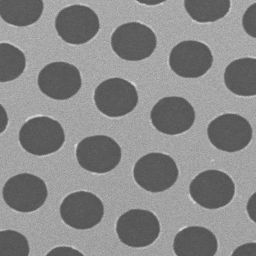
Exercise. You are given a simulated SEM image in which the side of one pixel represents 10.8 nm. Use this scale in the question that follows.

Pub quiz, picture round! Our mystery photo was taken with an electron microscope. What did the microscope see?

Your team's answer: a regular array of holes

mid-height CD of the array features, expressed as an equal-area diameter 449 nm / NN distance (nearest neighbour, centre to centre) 632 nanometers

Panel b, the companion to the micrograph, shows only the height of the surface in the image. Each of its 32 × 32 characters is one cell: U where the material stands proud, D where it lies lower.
DDDDDUUUUUUUUUUUUUDDUUUDDDDDDUUU
DDDDDUUUDDDDUUUUUUUUUUUDDDDDUUUD
DDDDDUUDDDDDUUUUUUUUUUUUDDDUUUDD
UUUUUUUDDDDDUUUDDDDUUUUUUUUUUUDD
UUUUUUUDDDDDUUDDDDDUUUUUUUUUUUUD
DUUUUUUUUDUUUUDDDDDDUUDDDDUUUUUU
DDDUUUUUUUUUUUDDDDDUUDDDDDUUUUUU
DDDUUUUUUUUUUUUUDDUUUDDDDDDUUDDD
DDDUUDDDDDUUUUUUUUUUUDDDDDUUDDDD
DDUUUDDDDDUUUUUUUUUUUUDDDUUUDDDD
UUUUUDDDDDUUDDDDUUUUUUUUUUUUDDDD
UUUUUDDDDDUUDDDDDUUUUUUUUUUUUDDD
UUUUUUUDUUUUDDDDDUUUDDDUUUUUUUUU
UUUUUUUUUUUUDDDDDUUDDDDDUUUUUUUU
DUUUUUUUUUUUUUDUUUUDDDDDUUUDDDUU
DUUDDDDUUUUUUUUUUUUDDDDDUUDDDDDU
UUDDDDDDUUUUUUUUUUUUDDDUUUDDDDDU
UUDDDDDDUUDDDDUUUUUUUUUUUUDDDDDU
UUUDDDDUUUDDDDDUUUUUUUUUUUUDDDUU
UUUUUUUUUUDDDDDUUUDDDUUUUUUUUUUU
UUUUUUUUUUDDDDDUUDDDDDUUUUUUUUUU
UUUUUUUUUUUUDUUUUDDDDDUUUDDDUUUU
UDDDDUUUUUUUUUUUUDDDDDUUDDDDDUUU
DDDDDDUUUUUUUUUUUUDDDUUUDDDDDUUU
DDDDDDUUDDDDUUUUUUUUUUUUDDDDDUUD
UDDDDUUUDDDDDUUUUUUUUUUUUDDDUUUD
UUUDUUUDDDDDDUUUDDDUUUUUUUUUUUUD
UUUUUUUUDDDDDUUDDDDDUUUUUUUUUUUU
UUUUUUUUUDDUUUDDDDDDUUUDDDUUUUUU
DDDUUUUUUUUUUUUDDDDDUUDDDDDUUUUU
DDDDUUUUUUUUUUUUDDDUUUDDDDDUUUUD
DDDDUUDDDDUUUUUUUUUUUUDDDDDUUDDD